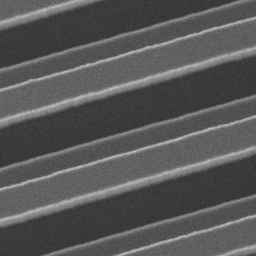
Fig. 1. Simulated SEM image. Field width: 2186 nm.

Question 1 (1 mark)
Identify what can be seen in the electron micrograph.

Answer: lines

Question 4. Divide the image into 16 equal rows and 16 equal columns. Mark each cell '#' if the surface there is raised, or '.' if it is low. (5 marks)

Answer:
####..........##
..........######
.......#########
...###########..
###########.....
#######.........
####..........##
#..........#####
.......#########
....###########.
############....
########........
#####..........#
#..........#####
........########
....############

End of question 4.